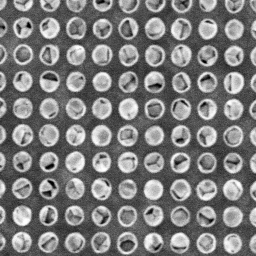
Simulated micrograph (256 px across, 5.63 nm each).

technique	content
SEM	a regular array of raised bodies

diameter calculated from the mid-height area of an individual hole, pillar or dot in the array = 99.5 nm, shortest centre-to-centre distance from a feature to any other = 144 nm